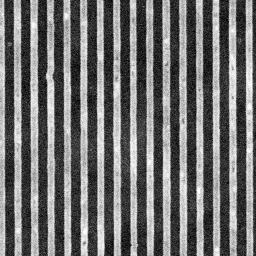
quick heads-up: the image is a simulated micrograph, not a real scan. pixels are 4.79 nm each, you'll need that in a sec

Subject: parallel lines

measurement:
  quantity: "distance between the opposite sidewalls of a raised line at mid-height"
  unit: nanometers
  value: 31.1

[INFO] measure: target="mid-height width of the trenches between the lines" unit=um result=0.0491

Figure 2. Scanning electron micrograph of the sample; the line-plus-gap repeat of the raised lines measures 0.0792 microns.